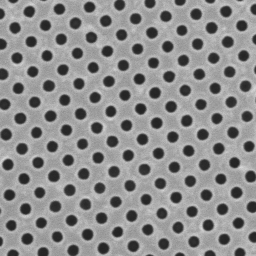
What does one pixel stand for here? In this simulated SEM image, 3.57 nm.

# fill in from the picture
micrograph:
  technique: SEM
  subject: a regular array of holes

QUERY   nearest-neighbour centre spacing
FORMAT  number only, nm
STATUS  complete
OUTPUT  75.3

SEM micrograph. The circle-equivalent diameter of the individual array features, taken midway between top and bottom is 11.3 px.